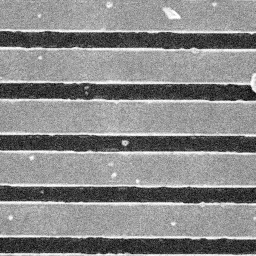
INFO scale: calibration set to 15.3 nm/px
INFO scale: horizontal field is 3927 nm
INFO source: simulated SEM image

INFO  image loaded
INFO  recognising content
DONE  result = lines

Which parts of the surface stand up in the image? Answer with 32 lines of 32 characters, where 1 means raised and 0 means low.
11111111111111111111111111111111
11111111111111111111111111111111
11111111111111111111111111111111
11111111111111111111111111111111
00000000000000000000000000000000
00000000000000000000000000000000
11111111111111111111111111111111
11111111111111111111111111111111
11111111111111111111111111111111
11111111111111111111111111111111
00000000000000000000000000000011
00000000000000000000000000000000
11111111000010000000000000000000
11111111111111111111111111111111
11111111111111111111111111111111
11111111111111111111111111111111
11111111111111111111111111111111
00000000000000000000000000000000
00000000000000000000000000000000
11111111111111111111111111111111
11111111111111111111111111111111
11111111111111111111111111111111
11111111111111111111111111111111
00000000000000000000000000000000
00000000000000000000000000000000
11111111111111111111110001011000
11111111111111111111111111111111
11111111111111111111111111111111
11111111111111111111111111111111
11111111111111111111111111111111
00000000000000000000000000000000
00000000000000000000000000000000